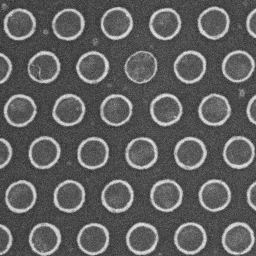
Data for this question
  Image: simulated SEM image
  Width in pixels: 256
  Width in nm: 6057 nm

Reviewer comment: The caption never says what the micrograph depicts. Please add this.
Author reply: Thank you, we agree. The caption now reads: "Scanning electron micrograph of a regular array of raised bodies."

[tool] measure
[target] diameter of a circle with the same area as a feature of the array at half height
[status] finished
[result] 695 nanometers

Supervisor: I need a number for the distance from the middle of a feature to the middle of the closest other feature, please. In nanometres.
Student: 1150